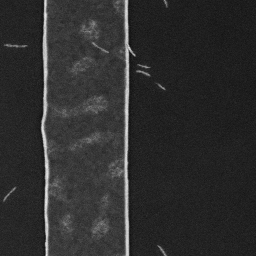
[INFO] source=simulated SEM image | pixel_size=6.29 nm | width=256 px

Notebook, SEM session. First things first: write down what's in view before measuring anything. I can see one or a few lines or trenches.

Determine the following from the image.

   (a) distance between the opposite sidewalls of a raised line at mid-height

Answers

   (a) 511 nm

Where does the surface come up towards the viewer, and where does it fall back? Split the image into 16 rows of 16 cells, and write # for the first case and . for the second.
...#####........
...#####........
...#####........
...#####........
...#####........
...#####........
...#####........
...#####........
...#####........
...#####........
...#####........
...#####........
...#####........
...#####........
...#####........
...#####........